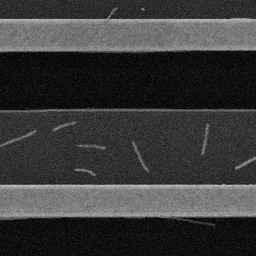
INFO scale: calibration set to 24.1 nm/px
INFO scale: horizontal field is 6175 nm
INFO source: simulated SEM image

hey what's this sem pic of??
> lines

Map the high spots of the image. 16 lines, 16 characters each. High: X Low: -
XXXXXXXXXXXXXXXX
XXXXXXXXXXXXXXXX
XXXXXXXXXXXXXXXX
----------------
----------------
----------------
----------------
XXXXXXXXXXXXXXXX
XXXXXXXXXXXXXXXX
XXXXXXXXXXXXXXXX
XXXXXXXXXXXXXXXX
XXXXXXXXXXXXXXXX
XXXXXXXXXXXXXXXX
XX-------XX-----
----------------
----------------